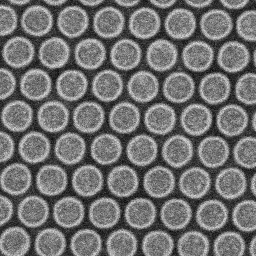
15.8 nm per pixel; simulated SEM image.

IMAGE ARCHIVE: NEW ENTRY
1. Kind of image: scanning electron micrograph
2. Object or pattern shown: a regular array of raised bodies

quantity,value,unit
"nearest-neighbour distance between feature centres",564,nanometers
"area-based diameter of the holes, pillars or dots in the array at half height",0.447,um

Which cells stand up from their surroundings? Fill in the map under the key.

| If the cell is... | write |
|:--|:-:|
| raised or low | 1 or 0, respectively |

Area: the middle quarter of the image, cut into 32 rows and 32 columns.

00000111000001111000001111000001
00000000000000000000000000000000
11110000011110000011100000000100
11111000111111000111111000111110
11111100111111000111111001111111
11111001111111001111111001111111
11111001111111001111111001111111
11111000111111000111111001111111
01100000011110000011110000111110
00000000000000000000000000000000
00001111000001111000000110000000
00011111100011111100011111100001
10011111110011111100011111100011
10011111100011111100111111100011
00011111100011111100111111100011
00011111100011111100011111100011
00000110000001111000001111000001
00000000000000000000000000000000
11110000011100000011100000011100
11111000111111000111111000111110
11111001111111001111111001111111
11111001111111001111111001111111
11111001111111001111111001111111
11110000111110000111110001111110
01100000011000000011100000111100
00000000000000000000000000000000
00001111000001111000001110000000
00011111100011111100011111100011
00111111100111111100111111100111
00111111100111111100111111100111
00011111100111111100111111100111
00011111000011111000011111100011